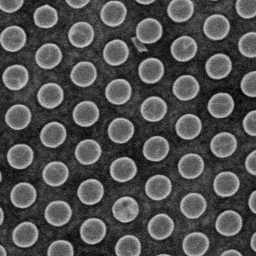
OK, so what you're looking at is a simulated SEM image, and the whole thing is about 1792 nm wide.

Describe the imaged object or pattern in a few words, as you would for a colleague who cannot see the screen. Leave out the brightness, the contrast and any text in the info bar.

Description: a regular array of raised bodies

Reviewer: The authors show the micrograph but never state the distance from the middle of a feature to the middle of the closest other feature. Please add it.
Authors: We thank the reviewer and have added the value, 38.8 px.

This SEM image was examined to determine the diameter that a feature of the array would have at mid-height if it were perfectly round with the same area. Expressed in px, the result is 25.5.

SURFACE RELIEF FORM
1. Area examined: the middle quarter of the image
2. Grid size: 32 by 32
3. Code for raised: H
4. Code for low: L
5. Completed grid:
LLLHHHHLLLLLLLLLLLLHHHHHHLLLLLLL
LLHHHHHHLLLLLLLLLLLHHHHHHLLLLLLL
LLHHHHHHLLLLLLLLLLLHHHHHHLLLLLLL
LLHHHHHHLLLLLLLLLLLHHHHHLLLLLHHH
LLHHHHHLLLLLHHHHLLLLHHHLLLLLHHHH
LLLLHLLLLLLHHHHHLLLLLLLLLLLHHHHH
LLLLLLLLLLHHHHHHHLLLLLLLLLLHHHHH
LLLLLLLLLLHHHHHHHLLLLLLLLLLLHHHH
LLLLLLLLLLLHHHHHLLLLLHHHLLLLLHHH
LLLLLHHLLLLLHHHLLLLLHHHHHLLLLLLL
LLLHHHHHLLLLLLLLLLLHHHHHHLLLLLLL
LLHHHHHHHLLLLLLLLLLHHHHHHHLLLLLL
LLHHHHHHHLLLLLLLLLLHHHHHHLLLLLLL
LLHHHHHHLLLLLLLLLLLLHHHHLLLLLHHH
LLLHHHHHLLLLHHHHLLLLLLLLLLLLHHHH
LLLLLHLLLLLHHHHHHLLLLLLLLLLLHHHH
LLLLLLLLLLLHHHHHHLLLLLLLLLLLHHHH
LLLLLLLLLLLHHHHHHLLLLLLLLLLLLHHH
LLLLLLLLLLLLHHHHHLLLLLHHHLLLLLHH
LLLLHHHHLLLLLHHLLLLLLHHHHHLLLLLL
LLLHHHHHHLLLLLLLLLLLHHHHHHLLLLLL
LLLHHHHHHLLLLLLLLLLLHHHHHHLLLLLL
LLLHHHHHHLLLLLLLLLLLHHHHHHLLLLLL
LLLHHHHHHLLLLLHHLLLLLHHHHLLLLLHH
LLLLHHHHLLLLLHHHHLLLLLLLLLLLLHHH
LLLLLLLLLLLLHHHHHHLLLLLLLLLLLHHH
HLLLLLLLLLLLHHHHHHLLLLLLLLLLLHHH
HLLLLLLLLLLLHHHHHHLLLLLLLLLLLHHH
HLLLLLLLLLLLHHHHHLLLLLHHHHLLLLLH
LLLLLHHHHLLLLLLLLLLLLHHHHHHLLLLL
LLLLHHHHHHLLLLLLLLLLHHHHHHHLLLLL
LLLLHHHHHHLLLLLLLLLLHHHHHHHLLLLL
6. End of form